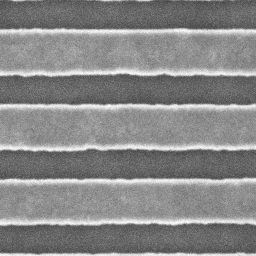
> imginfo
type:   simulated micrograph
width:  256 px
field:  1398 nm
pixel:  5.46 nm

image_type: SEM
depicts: lines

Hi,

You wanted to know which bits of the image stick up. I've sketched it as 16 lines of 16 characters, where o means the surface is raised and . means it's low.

................
................
oooooooooooooooo
oooooooooooooooo
oooooooooooooooo
................
................
oooooooooooooooo
oooooooooooooooo
................
................
oooooooooooooooo
oooooooooooooooo
oooooooooooooooo
................
................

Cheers